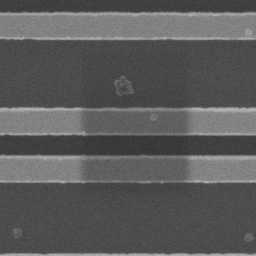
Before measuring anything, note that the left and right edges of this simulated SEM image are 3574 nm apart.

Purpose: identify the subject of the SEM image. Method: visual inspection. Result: lines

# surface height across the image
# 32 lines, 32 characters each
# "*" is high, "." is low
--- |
................................
................................
********************************
********************************
********************************
................................
................................
................................
................................
................................
................................
................................
................................
................................
********************************
********************************
********************************
................................
................................
********************************
********************************
********************************
********************************
................................
................................
................................
................................
................................
................................
................................
................................
................................